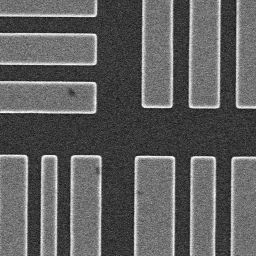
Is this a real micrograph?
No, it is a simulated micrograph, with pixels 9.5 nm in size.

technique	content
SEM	groups of lines, slits or small figures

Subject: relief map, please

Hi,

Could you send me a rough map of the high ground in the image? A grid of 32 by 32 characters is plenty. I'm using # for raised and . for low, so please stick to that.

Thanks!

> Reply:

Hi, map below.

############......###...###...##
############......###...###...##
..................###...###...##
..................###...###...##
############......###...###...##
############......###...###...##
############......###...###...##
############......###...###...##
..................###...###...##
..................###...###...##
############......###...###...##
############......###...###...##
############......###...###...##
############....................
................................
................................
................................
................................
................................
###...#..###....................
###..##..####....#####..###..###
###..##..####....#####..###..###
###..##..####....#####..###..###
###..##..####....#####..###..###
###..##..####....#####..###..###
###..##..####....#####..###..###
###..##..####....#####..###..###
###..##..####....#####..###..###
###..##..####....#####..###..###
###..##..####....#####..###..###
###..##..####....#####..###..###
###..##..####....#####..###..###